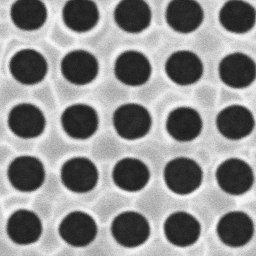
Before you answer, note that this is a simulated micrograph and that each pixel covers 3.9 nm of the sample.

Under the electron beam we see a regular array of holes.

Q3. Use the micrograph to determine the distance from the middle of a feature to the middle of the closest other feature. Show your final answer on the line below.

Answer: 200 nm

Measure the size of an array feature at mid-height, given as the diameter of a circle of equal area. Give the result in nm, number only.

145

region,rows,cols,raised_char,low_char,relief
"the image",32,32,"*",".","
**...***....***...***....***...*
*.....**....**.....**....**.....
*.....**....**.....**....**.....
**...****...***...***....***....
********************************
********************************
**...****..*****.*****..********
*.....**....***....**....***....
*.....**....**.....**....**.....
**....**....**.....**....**.....
***.*****..*****..****..****...*
********************************
********************************
**...***....***...****..****...*
*.....**....**.....**....**.....
*.....**....**.....**....**.....
**...***....***....**....**....*
****************.*****..********
********************************
**.*****************************
*....***....**....***....***...*
*.....**....**.....*.....**.....
*.....**....**.....**....**.....
**...***....***...***....***...*
********************************
********************************
**..*****.*****..*****.******.**
*....***....**....***....**....*
*....**.....**.....*.....**.....
*....***....**.....**....**.....
**..*****..****...****..****...*
********************************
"